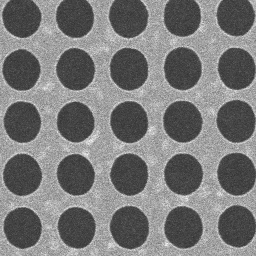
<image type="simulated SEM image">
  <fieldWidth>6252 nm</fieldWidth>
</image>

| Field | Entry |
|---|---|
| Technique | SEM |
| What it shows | a regular array of holes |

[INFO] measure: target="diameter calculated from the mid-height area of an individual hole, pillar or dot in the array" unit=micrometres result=0.997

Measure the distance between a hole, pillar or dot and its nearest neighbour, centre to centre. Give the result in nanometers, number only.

1280